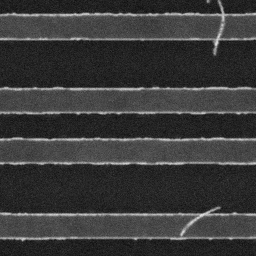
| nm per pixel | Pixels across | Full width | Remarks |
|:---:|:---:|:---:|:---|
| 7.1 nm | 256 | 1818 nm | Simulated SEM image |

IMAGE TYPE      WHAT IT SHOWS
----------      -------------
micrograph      lines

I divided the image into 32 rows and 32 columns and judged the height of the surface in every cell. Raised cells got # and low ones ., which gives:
................................
................................
################################
################################
################################
................................
................................
................................
................................
................................
................................
################################
################################
################################
................................
................................
................................
################################
################################
################################
................................
................................
................................
................................
................................
................................
................................
################################
################################
################################
................................
................................